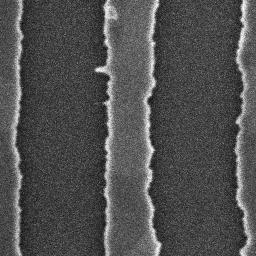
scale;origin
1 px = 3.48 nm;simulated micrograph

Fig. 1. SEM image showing one or a few lines or trenches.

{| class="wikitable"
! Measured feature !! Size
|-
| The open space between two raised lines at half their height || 0.305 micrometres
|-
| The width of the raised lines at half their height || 160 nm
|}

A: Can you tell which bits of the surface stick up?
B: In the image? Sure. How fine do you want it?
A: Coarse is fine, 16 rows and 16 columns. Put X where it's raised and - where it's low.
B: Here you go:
X------XXX-----X
X------XXX-----X
X------XXX-----X
X------XXX-----X
X------XXX-----X
X------XXX-----X
X------XX------X
X------XX------X
X------XX------X
X------XX------X
X------XX------X
X------XX------X
X------XX------X
X------XXX-----X
X------XXX-----X
X------XXX-----X